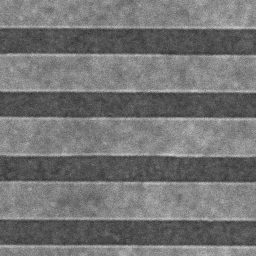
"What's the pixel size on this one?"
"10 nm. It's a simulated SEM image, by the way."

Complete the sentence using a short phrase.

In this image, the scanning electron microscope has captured one or a few lines or trenches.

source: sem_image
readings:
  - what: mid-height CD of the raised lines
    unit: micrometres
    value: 0.365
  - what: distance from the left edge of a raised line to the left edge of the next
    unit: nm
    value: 640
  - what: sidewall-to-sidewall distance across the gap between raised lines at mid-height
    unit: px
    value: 27.2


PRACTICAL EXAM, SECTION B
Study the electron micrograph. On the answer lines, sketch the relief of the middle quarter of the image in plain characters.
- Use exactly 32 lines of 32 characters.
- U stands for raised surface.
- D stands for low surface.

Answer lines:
UUUUUUUUUUUUUUUUUUUUUUUUUUUUUUUU
UUUUUUUUUUUUUUUUUUUUUUUUUUUUUUUU
UUUUUUUUUUUUUUUUUUUUUUUUUUUUUUUU
UUUUUUUUUUUUUUUUUUUUUUUUUUUUUUUU
UUUUUUUUUUUUUUUUUUUUUUUUUUUUUUUU
UUUUUUUUUUUUUUUUUUUUUUUUUUUUUUUU
UUUUUUUUUUUUUUUUUUUUUUUUUUUUUUUU
DDDDDDDDDDDDDDDDDDDDDDDDDDDDDDDD
DDDDDDDDDDDDDDDDDDDDDDDDDDDDDDDD
DDDDDDDDDDDDDDDDDDDDDDDDDDDDDDDD
DDDDDDDDDDDDDDDDDDDDDDDDDDDDDDDD
DDDDDDDDDDDDDDDDDDDDDDDDDDDDDDDD
DDDDDDDDDDDDDDDDDDDDDDDDDDDDDDDD
DDDDDDDDDDDDDDDDDDDDDDDDDDDDDDDD
UUUUUUUUUUUUUUUUUUUUUUUUUUUUUUUU
UUUUUUUUUUUUUUUUUUUUUUUUUUUUUUUU
UUUUUUUUUUUUUUUUUUUUUUUUUUUUUUUU
UUUUUUUUUUUUUUUUUUUUUUUUUUUUUUUU
UUUUUUUUUUUUUUUUUUUUUUUUUUUUUUUU
UUUUUUUUUUUUUUUUUUUUUUUUUUUUUUUU
UUUUUUUUUUUUUUUUUUUUUUUUUUUUUUUU
UUUUUUUUUUUUUUUUUUUUUUUUUUUUUUUU
UUUUUUUUUUUUUUUUUUUUUUUUUUUUUUUU
DDDDDDDDDDDDDDDDDDDDDDDDDDDDDDDD
DDDDDDDDDDDDDDDDDDDDDDDDDDDDDDDD
DDDDDDDDDDDDDDDDDDDDDDDDDDDDDDDD
DDDDDDDDDDDDDDDDDDDDDDDDDDDDDDDD
DDDDDDDDDDDDDDDDDDDDDDDDDDDDDDDD
DDDDDDDDDDDDDDDDDDDDDDDDDDDDDDDD
DDDDDDDDDDDDDDDDDDDDDDDDDDDDDDDD
UUUUUUUUUUUUUUUUUUUUUUUUUUUUUUUU
UUUUUUUUUUUUUUUUUUUUUUUUUUUUUUUU